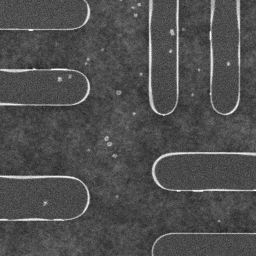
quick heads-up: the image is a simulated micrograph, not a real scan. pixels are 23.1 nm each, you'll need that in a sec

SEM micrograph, groups of lines, slits or small figures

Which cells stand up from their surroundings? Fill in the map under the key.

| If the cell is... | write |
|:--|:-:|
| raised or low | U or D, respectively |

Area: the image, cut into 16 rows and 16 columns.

UUUUUUDDDUUDDUUD
UUUUUDDDDUUDDUUD
DDDDDDDDDUUDDUUD
DDDDDDDDDUUDDUUD
UUUUUDDDDUUDDUUD
UUUUUUDDDUUDDUUD
UUUUUDDDDDUDDUUD
DDDDDDDDDDDDDDDD
DDDDDDDDDDDDDDDD
DDDDDDDDDDDDDDDD
DDDDDDDDDDUUUUUU
UUUUUDDDDDUUUUUU
UUUUUUDDDDDDDDDD
UUUUUDDDDDDDDDDD
DDDDDDDDDDDDDDDD
DDDDDDDDDDUUUUUU